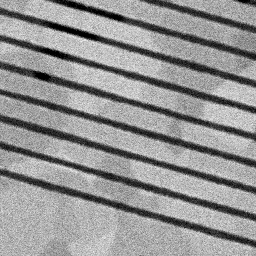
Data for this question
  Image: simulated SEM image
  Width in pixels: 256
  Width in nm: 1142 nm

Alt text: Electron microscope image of parallel lines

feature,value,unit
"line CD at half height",78.3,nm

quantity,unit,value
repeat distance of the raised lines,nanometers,115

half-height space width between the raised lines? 37 nm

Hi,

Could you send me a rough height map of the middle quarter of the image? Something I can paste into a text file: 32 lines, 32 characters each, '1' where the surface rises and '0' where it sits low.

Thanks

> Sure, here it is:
11111000000011111111111111110000
11111111100000001111111111111110
11111111111110000000111111111111
11111111111111100000000111111111
00011111111111111110000000011111
00000001111111111111110000000011
11000000001111111111111111000000
11111100000001111111111111111100
11111111100000001111111111111111
11111111111110000000111111111111
01111111111111111000000111111111
00001111111111111111000000011111
00000000111111111111111100000011
11110000000111111111111111100000
11111110000000111111111111111110
11111111111000000011111111111111
11111111111111000000001111111111
00111111111111111100000001111111
00000111111111111111100000000111
10000000011111111111111110000000
11111000000011111111111111110000
11111111000000011111111111111111
11111111111100000001111111111111
11111111111111100000001111111111
00111111111111111110000000111111
00000011111111111111110000000011
11100000001111111111111111000000
11111100000001111111111111111000
11111111100000000111111111111111
11111111111110000000111111111111
11111111111111110000000011111111
00001111111111111111000000011111